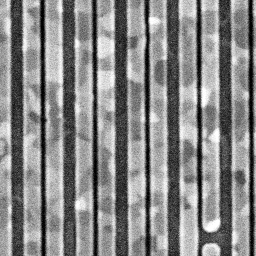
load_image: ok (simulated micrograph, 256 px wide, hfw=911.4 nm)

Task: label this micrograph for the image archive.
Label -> parallel lines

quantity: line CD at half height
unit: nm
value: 54.8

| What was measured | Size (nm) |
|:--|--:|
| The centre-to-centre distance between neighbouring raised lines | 92.7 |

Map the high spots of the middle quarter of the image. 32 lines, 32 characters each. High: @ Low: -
---@@@@--@@@----@@@@--@@@----@@@
---@@@@--@@@----@@@@--@@@----@@@
---@@@@--@@@----@@@@--@@@----@@@
---@@@@--@@@----@@@@--@@@----@@@
---@@@@--@@@----@@@@--@@@----@@@
---@@@@--@@@----@@@@--@@@----@@@
---@@@@--@@@----@@@@--@@@----@@@
---@@@@--@@@----@@@@--@@@----@@@
---@@@@-@@@@----@@@@--@@@----@@@
---@@@@--@@@----@@@@--@@@@---@@@
---@@@@--@@@----@@@@--@@@@---@@@
---@@@@--@@@----@@@@--@@@@---@@@
---@@@@--@@@----@@@@--@@@@---@@@
---@@@@--@@@----@@@@--@@@----@@@
---@@@@--@@@----@@@@--@@@----@@@
---@@@@--@@@----@@@@--@@@----@@@
---@@@@--@@@@---@@@@--@@@----@@@
---@@@@--@@@@---@@@@--@@@----@@@
---@@@@--@@@@---@@@@--@@@@---@@@
---@@@@--@@@----@@@@--@@@@---@@@
---@@@@--@@@----@@@@--@@@@---@@@
---@@@@--@@@----@@@@--@@@@---@@@
---@@@@--@@@----@@@@--@@@@---@@@
---@@@@--@@@----@@@@--@@@@---@@@
---@@@@--@@@----@@@@--@@@@---@@@
---@@@@--@@@----@@@@--@@@@---@@@
---@@@@--@@@----@@@@--@@@@---@@@
---@@@@--@@@----@@@@--@@@@---@@@
---@@@@--@@@----@@@@--@@@@---@@@
---@@@@--@@@----@@@@--@@@@---@@@
---@@@@--@@@----@@@@--@@@@---@@@
---@@@@--@@@----@@@@--@@@@---@@@